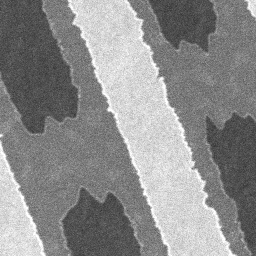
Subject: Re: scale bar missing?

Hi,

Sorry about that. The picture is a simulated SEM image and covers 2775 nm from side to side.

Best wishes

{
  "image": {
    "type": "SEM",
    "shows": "one or a few lines or trenches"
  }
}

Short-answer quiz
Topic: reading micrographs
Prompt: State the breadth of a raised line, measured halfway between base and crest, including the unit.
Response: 615 nanometers